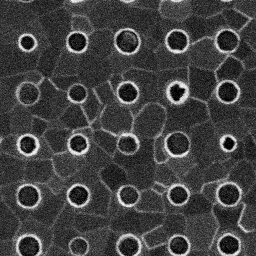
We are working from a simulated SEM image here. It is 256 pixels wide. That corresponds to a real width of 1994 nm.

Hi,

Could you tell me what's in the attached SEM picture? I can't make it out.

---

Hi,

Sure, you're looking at a regular array of holes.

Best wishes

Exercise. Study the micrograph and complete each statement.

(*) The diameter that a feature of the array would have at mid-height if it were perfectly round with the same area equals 147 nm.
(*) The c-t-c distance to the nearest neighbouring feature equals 49.6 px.